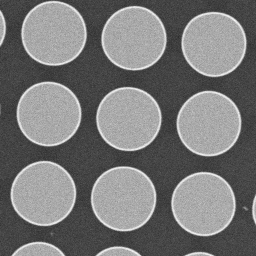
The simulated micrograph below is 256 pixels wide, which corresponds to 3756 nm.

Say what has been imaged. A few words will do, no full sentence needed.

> an array of small figures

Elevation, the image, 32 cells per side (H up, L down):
LLLLLHHHLLLLLLLLLLLLLLLLLLLLLLLL
LLLLHHHHHHLLLLLHHHHLLLLLLLLLLLLL
HLLHHHHHHHLLLLHHHHHHLLLLHHHHHLLL
HLLHHHHHHHHLLHHHHHHHHLLHHHHHHHLL
HLLHHHHHHHHLLHHHHHHHHLLHHHHHHHHL
LLLHHHHHHHHLLHHHHHHHHLLHHHHHHHHL
LLLHHHHHHHLLLHHHHHHHLLLHHHHHHHHL
LLLLHHHHHLLLLLHHHHHHLLLHHHHHHHLL
LLLLLLLLLLLLLLLHHHLLLLLLHHHHHLLL
LLLLLLLLLLLLLLLLLLLLLLLLLLHHLLLL
LLLLLHHHLLLLLLLLLLLLLLLLLLLLLLLL
LLLHHHHHHLLLLLHHHHLLLLLLLHHLLLLL
LLHHHHHHHHLLLHHHHHHLLLLHHHHHHLLL
LLHHHHHHHHLLHHHHHHHHLLLHHHHHHHLL
LLHHHHHHHHLLHHHHHHHHLLHHHHHHHHLL
LLHHHHHHHHLLHHHHHHHHLLHHHHHHHHLL
LLLHHHHHHLLLHHHHHHHHLLHHHHHHHHLL
LLLLHHHHLLLLLHHHHHHLLLLHHHHHHHLL
LLLLLLLLLLLLLLHHHHLLLLLHHHHHHLLL
LLLLLLLLLLLLLLLLLLLLLLLLLLLLLLLL
LLLLHHHLLLLLLLLLLLLLLLLLLLLLLLLL
LLLHHHHHLLLLLHHHHHLLLLLLLLLLLLLL
LLHHHHHHHLLLHHHHHHHLLLLHHHHHLLLL
LHHHHHHHHLLLHHHHHHHLLLHHHHHHHLLL
LHHHHHHHHLLHHHHHHHHLLLHHHHHHHLLL
LLHHHHHHHLLHHHHHHHHLLLHHHHHHHLLL
LLHHHHHHHLLLHHHHHHHLLLHHHHHHHLLL
LLLHHHHHLLLLHHHHHHHLLLHHHHHHHLLL
LLLLLLLLLLLLLLHHHLLLLLLHHHHHLLLL
LLLLLLLLLLLLLLLLLLLLLLLLLLLLLLLL
LLLLHHLLLLLLLLLLLLLLLLLLLLLLLLLL
LLHHHHHHLLLLLHHHHLLLLLLLLLLLLLLL